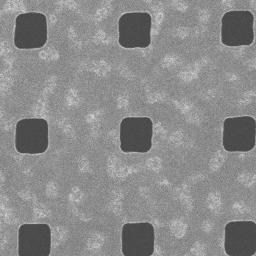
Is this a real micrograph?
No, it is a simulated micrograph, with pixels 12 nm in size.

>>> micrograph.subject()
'holes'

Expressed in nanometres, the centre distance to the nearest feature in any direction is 1250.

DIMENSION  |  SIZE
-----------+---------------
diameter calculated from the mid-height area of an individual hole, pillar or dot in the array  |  440 nanometres